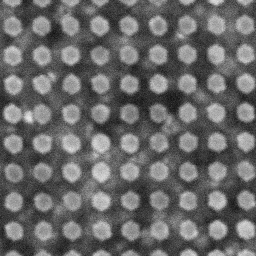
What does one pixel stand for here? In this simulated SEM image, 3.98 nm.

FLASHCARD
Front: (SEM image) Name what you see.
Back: a regular array of raised bodies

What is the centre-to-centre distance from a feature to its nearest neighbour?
114 nm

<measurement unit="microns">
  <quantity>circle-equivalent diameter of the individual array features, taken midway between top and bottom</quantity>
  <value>0.0679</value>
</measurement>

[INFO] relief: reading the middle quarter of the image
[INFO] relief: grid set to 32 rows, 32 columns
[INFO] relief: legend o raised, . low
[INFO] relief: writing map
................................
................................
................................
.oo.....ooo....ooo....ooo....ooo
oooo...oooo...oooo....oooo...ooo
oooo...oooo...oooo....oooo...ooo
oooo....ooo....ooo....ooo.....oo
................................
................................
................................
.o......oo.....oo.....oo......oo
oooo...oooo...oooo....ooo....ooo
oooo...oooo....ooo....ooo....ooo
oooo...oooo....ooo....ooo....ooo
.oo......o......o...............
................................
................................
.......................o........
ooo....oooo....ooo....ooo....ooo
oooo...oooo....ooo....ooo....ooo
oooo...oooo....ooo....oooo...ooo
.oo.....oo.....ooo.....oo.....oo
................................
................................
................................
ooo.....ooo....ooo....ooo....ooo
oooo...oooo...oooo....oooo...ooo
oooo....ooo....ooo....oooo...ooo
oooo....ooo....ooo.....oo.....oo
................................
................................
................................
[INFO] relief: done